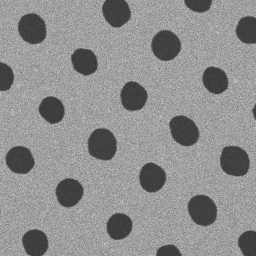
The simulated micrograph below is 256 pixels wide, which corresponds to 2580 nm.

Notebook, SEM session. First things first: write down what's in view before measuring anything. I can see a regular array of holes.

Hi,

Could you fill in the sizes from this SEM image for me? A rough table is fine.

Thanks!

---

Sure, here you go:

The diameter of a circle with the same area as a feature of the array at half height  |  0.284 micrometres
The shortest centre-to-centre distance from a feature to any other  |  0.59 µm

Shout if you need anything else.